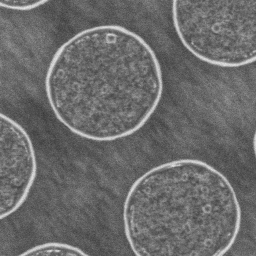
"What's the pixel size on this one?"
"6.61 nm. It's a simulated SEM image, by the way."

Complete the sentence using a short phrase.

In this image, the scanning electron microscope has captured raised bodies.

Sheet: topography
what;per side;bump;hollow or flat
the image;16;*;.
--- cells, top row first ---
.*.........*****
...........*****
....*****..*****
....******..****
...*******......
...*******......
...*******......
*...*****.......
**...***........
**..............
**........***...
**......******..
*.......*******.
........*******.
........*******.
..***...******..